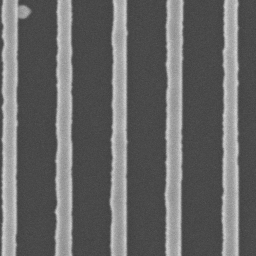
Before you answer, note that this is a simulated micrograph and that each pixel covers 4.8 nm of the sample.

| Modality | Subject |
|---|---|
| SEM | lines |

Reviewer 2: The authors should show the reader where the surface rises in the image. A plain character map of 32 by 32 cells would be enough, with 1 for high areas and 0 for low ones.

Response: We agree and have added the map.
11000001100000110000011000001100
11000001100000110000011000001100
11000001100000110000011000001100
11000001100000110000011000001100
11000001100000110000011000001100
01000001100000110000011000001100
11000001100000110000011000001100
11000001100000110000011000001100
11000001100000110000011000001100
11000001100000110000011000001100
11000001100000110000011000001100
11000001100000110000011000001100
11000001100000110000011000001100
11000001100000110000011000001100
11000001100000110000011000001100
11000001100000110000011000001100
11000001100000110000011000001100
11000001100000110000011000001100
11000001100000110000011000001100
11000001100000110000011000001100
11000001100000110000011000001100
11000001100000110000011000001100
11000001100000110000011000001100
11000001100000110000011000001100
11000001100000110000011000001100
11000001100000110000011000001100
11000001100000110000011000001100
11000001100000110000011000001100
11000001100000110000011000001100
11000001100000110000011000001100
11000001100000110000011000001100
11000001100000110000011000001100